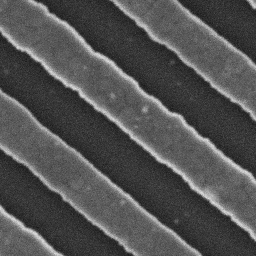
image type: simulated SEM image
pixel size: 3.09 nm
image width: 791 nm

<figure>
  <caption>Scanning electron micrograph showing lines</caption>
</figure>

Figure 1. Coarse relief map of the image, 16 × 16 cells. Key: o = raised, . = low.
ooo....ooooo....
oooo.....oooo...
.oooo.....oooo..
..oooo.....oooo.
...ooooo....oooo
.....oooo....ooo
o.....oooo.....o
oo.....oooo.....
oooo....ooooo...
ooooo....ooooo..
..oooo.....oooo.
...oooo.....oooo
....oooo.....ooo
o....ooooo....oo
oo.....oooo.....
ooo.....oooo....